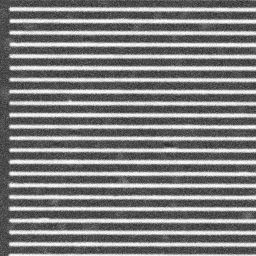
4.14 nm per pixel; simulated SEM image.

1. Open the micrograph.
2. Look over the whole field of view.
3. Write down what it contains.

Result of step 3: parallel lines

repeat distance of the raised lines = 0.0486 µm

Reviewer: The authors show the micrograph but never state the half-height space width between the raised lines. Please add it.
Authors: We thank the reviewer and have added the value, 37.3 nm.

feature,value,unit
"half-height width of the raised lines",9.8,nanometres